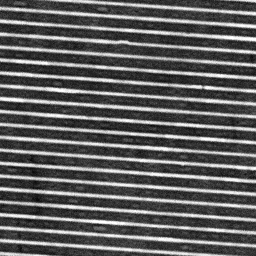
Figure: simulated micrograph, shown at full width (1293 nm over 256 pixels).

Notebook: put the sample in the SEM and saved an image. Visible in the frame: parallel lines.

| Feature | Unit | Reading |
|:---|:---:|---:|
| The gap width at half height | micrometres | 0.0492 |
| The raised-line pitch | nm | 65.1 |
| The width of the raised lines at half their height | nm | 14.5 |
